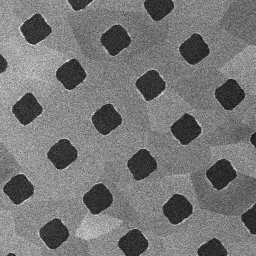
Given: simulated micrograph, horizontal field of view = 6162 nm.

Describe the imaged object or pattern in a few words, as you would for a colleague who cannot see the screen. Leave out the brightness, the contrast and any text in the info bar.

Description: a regular array of holes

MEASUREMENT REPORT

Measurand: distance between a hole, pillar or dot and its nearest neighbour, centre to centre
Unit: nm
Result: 1350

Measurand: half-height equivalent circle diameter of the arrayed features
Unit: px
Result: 29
